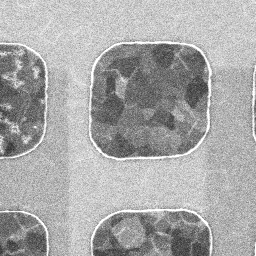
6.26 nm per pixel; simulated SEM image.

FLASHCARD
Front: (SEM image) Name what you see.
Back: raised bodies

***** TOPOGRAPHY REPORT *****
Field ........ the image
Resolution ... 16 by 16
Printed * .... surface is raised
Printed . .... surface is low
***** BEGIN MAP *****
................
................
................
**....*******...
***...*******...
.**...*******...
..*...*******...
.**...*******...
***...*******...
**....******....
................
................
................
**.....*****....
***...*******...
***...*******...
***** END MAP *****